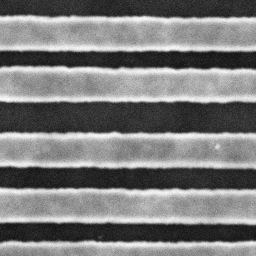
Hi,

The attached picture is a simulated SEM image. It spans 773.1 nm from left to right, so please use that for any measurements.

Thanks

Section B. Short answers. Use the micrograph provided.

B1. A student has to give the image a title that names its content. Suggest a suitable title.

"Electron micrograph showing lines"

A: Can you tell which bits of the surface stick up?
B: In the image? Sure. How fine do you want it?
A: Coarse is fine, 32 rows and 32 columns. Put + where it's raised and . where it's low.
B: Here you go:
................................
................................
++++++++++++++++++++++++++++++++
++++++++++++++++++++++++++++++++
++++++++++++++++++++++++++++++++
++++++++++++++++++++++++++++++++
................................
................................
+++++++++.++....................
++++++++++++++++++++++++++++++++
++++++++++++++++++++++++++++++++
++++++++++++++++++++++++++++++++
++++++++++++++++++++++++++++++++
................................
................................
................................
................................
++++++++++++++++++++++++++++++++
++++++++++++++++++++++++++++++++
++++++++++++++++++++++++++++++++
++++++++++++++++++++++++++++++++
................................
................................
................................
++++++++++++++++++++++++++++++++
++++++++++++++++++++++++++++++++
++++++++++++++++++++++++++++++++
++++++++++++++++++++++++++++++++
................................
................................
++++++++++++++++++++++++++++++++
++++++++++++++++++++++++++++++++